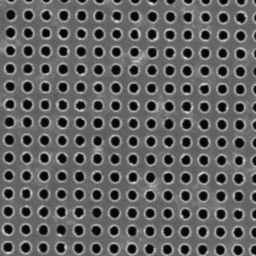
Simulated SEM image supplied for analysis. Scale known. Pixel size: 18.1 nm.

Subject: a regular array of holes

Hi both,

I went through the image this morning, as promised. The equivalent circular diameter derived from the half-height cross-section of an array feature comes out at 176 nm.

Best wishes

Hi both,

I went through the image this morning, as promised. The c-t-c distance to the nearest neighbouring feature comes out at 318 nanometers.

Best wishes